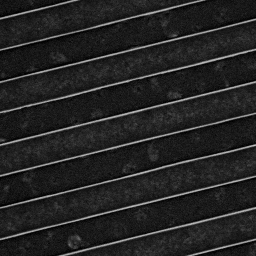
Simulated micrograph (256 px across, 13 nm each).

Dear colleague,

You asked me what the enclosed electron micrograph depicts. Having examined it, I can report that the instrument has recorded one or a few lines or trenches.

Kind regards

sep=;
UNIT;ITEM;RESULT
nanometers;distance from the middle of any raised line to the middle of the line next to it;793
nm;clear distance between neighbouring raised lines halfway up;394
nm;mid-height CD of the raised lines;394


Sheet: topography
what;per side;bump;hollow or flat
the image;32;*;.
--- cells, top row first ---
.......****************.........
...*****************............
***************.................
************................****
*******................*********
***................*************
...............****************.
...........****************.....
.......****************.........
...****************.............
**************.................*
***********................*****
*******................*********
***................*************
...............****************.
..........*****************.....
......****************..........
..****************..............
**************................**
**********................******
******................**********
**................**************
..............****************..
..........****************......
......****************..........
..****************..............
**************................**
**********................******
******................**********
**................**************
.............*****************..
.........*****************......